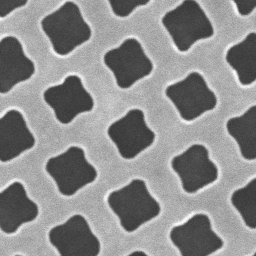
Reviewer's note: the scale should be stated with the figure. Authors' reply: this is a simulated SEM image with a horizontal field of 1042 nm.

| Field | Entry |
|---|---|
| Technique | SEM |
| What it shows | a regular array of holes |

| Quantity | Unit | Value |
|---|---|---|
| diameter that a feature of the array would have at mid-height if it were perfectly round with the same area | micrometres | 0.181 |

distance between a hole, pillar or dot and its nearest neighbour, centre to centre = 288 nm